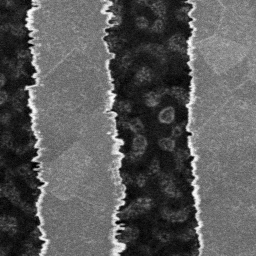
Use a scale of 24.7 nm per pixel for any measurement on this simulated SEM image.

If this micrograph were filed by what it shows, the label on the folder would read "one or a few lines or trenches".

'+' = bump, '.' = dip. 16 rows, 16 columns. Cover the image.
..+++++.....++++
..+++++.....++++
..+++++.....++++
..+++++.....++++
..+++++.....++++
..+++++.....++++
..+++++.....++++
..+++++.....++++
..+++++.....++++
..+++++.....++++
..+++++.....++++
...+++++....++++
..++++++....++++
..+++++.....++++
...++++.....++++
...++++......+++